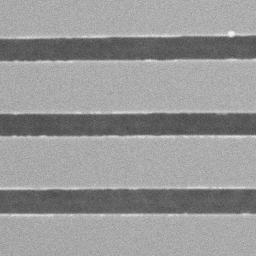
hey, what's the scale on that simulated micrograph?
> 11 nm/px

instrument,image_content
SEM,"lines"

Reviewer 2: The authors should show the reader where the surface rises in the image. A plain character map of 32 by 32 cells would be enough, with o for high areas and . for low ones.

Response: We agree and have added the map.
oooooooooooooooooooooooooooooooo
oooooooooooooooooooooooooooooooo
oooooooooooooooooooooooooooooooo
oooooooooooooooooooooooooooooooo
ooooooooooooooooooooooo.....o...
................................
................................
............................oooo
oooooooooooooooooooooooooooooooo
oooooooooooooooooooooooooooooooo
oooooooooooooooooooooooooooooooo
oooooooooooooooooooooooooooooooo
oooooooooooooooooooooooooooooooo
oooooooooooooooooooooooooooooooo
................................
................................
................................
oooooooooooooooooooooooooooooooo
oooooooooooooooooooooooooooooooo
oooooooooooooooooooooooooooooooo
oooooooooooooooooooooooooooooooo
oooooooooooooooooooooooooooooooo
oooooooooooooooooooooooooooooooo
oooooooooooooooooooooooooooooooo
................................
................................
................................
oooooooooooooooooooooooooooooooo
oooooooooooooooooooooooooooooooo
oooooooooooooooooooooooooooooooo
oooooooooooooooooooooooooooooooo
oooooooooooooooooooooooooooooooo